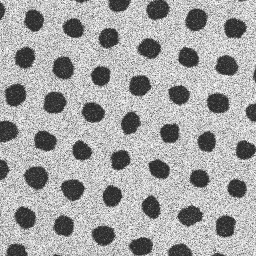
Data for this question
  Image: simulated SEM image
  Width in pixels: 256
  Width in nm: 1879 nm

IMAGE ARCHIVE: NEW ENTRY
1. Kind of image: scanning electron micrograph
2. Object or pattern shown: a regular array of holes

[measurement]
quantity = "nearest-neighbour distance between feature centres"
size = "277 nanometers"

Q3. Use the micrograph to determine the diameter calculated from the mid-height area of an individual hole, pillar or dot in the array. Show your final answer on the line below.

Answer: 154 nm